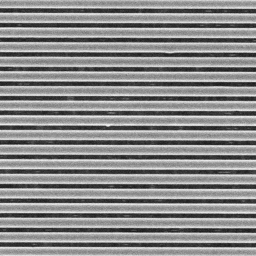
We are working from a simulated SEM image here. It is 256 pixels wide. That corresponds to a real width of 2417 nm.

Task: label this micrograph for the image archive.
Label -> parallel lines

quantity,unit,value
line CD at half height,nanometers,93.2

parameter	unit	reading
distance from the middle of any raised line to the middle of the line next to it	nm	138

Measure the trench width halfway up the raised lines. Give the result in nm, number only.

46